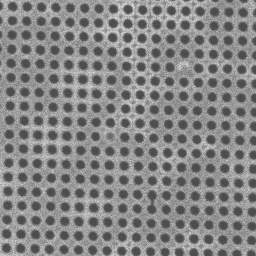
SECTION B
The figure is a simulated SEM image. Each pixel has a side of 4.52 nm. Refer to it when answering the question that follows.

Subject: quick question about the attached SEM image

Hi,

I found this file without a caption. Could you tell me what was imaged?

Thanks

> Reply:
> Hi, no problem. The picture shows a regular array of holes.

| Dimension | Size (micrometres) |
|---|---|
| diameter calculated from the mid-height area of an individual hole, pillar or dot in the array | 0.0417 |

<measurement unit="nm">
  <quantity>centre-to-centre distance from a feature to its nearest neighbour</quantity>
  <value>63.5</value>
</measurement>